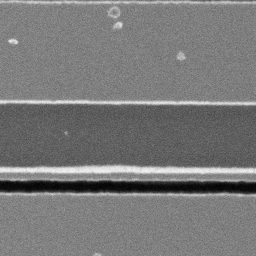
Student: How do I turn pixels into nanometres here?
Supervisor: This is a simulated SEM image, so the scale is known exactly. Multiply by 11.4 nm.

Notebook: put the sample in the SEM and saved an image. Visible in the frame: lines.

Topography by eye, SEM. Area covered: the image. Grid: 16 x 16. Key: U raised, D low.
UUUUUUUUUUUUUUUU
UUUUUUUUUUUUUUUU
UUUUUUUUUUUUUUUU
UUUUUUUUUUUUUUUU
UUUUUUUUUUUUUUUU
UUUUUUUUUUUUUUUU
DDDDDDDDDDDDDDDD
DDDDDDDDDDDDDDDD
DDDDDDDDDDDDDDDD
DDDDDDDDDDDDDDDD
DDDDDDDDDDDDDDDD
DDDDDDDDDDDDDDDD
UUUUUUUUUUUUUUUU
UUUUUUUUUUUUUUUU
UUUUUUUUUUUUUUUU
UUUUUUUUUUUUUUUU